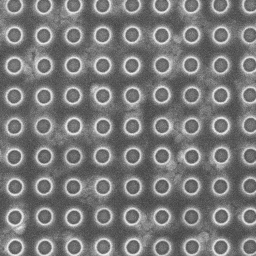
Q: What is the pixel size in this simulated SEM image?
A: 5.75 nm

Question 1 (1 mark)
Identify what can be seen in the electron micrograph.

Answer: a regular array of holes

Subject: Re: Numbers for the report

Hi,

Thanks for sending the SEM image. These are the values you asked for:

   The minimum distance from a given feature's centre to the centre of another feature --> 168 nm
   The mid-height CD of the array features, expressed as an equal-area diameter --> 0.0846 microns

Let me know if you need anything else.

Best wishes